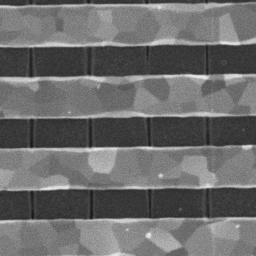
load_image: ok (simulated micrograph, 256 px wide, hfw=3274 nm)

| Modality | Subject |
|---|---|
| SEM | wiring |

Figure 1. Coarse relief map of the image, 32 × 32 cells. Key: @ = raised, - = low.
-----------------------------@@@
@@@@@@@@@@@@@@@@@@@@@@@@@@@@@@@@
@@@@@@@@@@@@@@@@@@@@@@@@@@@@@@@@
@@@@@@@@@@@@@@@@@@@@@@@@@@@@@@@@
@@@@@@@@@@@@@@@@@@@@@@@@@@@@@@@@
@@@@@@@@@@@@@@@@@@@-------------
--------------------------------
--------------------------------
--------------------------------
----------------------@@-------@
@@@@@@@@@@@@@@@@@@@@@@@@@@@@@@@@
@@@@@@@@@@@@@@@@@@@@@@@@@@@@@@@@
@@@@@@@@@@@@@@@@@@@@@@@@@@@@@@@@
@@@@@@@@@@@@@@@@@@@@@@@@@@@@@@@@
@@@@@@@@@@@@--------------------
--------------------------------
--------------------------------
--------------------------------
---------------@@@@----@@@@@@@@@
@@@@@@@@@@@@@@@@@@@@@@@@@@@@@@@@
@@@@@@@@@@@@@@@@@@@@@@@@@@@@@@@@
@@@@@@@@@@@@@@@@@@@@@@@@@@@@@@@@
@@@@@@@@@@@@@@@@@@@@@@@@@@@@@@@@
@@@@@@@---@@@@@@-@@@@-@@@@------
--------------------------------
--------------------------------
--------------------------------
-------@----@@----@@@@@@@@-@@@@@
@@@@@@@@@@@@@@@@@@@@@@@@@@@@@@@@
@@@@@@@@@@@@@@@@@@@@@@@@@@@@@@@@
@@@@@@@@@@@@@@@@@@@@@@@@@@@@@@@@
@@@@@@@@@@@@@@@@@@@@@@@@@@@@@@@@